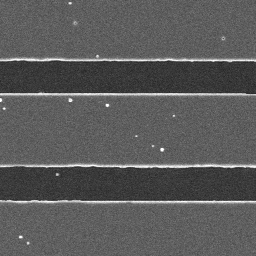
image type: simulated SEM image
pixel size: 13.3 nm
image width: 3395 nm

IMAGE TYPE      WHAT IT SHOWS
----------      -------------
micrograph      lines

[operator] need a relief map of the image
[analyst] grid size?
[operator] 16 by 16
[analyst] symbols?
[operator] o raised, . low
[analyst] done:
oooooooooooooooo
oooooooooooooooo
oooooooooooooooo
oooooooooooooooo
................
................
oooooooooooooooo
oooooooooooooooo
oooooooooooooooo
oooooooooooooooo
................
................
................
oooooooooooooooo
oooooooooooooooo
oooooooooooooooo